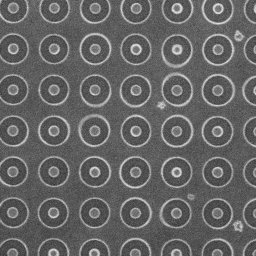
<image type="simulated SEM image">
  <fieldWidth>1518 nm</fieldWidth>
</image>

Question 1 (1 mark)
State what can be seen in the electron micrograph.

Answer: an array of small figures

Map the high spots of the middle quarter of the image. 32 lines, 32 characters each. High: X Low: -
XXXXXXXXXXXXXXXXXXXXXXXXXXXX-XXX
XXXXXXXXXXXXXXXXXXXXXXXXXXXXXXXX
XXXXXXXXXXXXXXXXXXXXXXXXXXXXXXXX
XXXXXX----XXXXXX----XXXXXX-----X
XXXXX------XXXX------XXXX------X
-XXX---X---XXX---XX--XXXX---X---
-XXX---XX---XX---XX---XXX--XX---
-XXX---XX--XXX---XX--XXXX--XX---
XXXXX------XXXX------XXXX-------
XXXXX-----XXXXX-----XXXXXX-----X
XXXXXXXXXXXXXXXXX-XXXXXXXXXXXXXX
XXXXXXXXXXXXXXXXXXXXXXXXXXXXXXXX
XXXXXXXXXXXXXXXXXXXXXXXXXXXXXXXX
XXXXXX----XXXXXX----XXXXXX----XX
XXXXX------XXXX------XXXX------X
-XXX-------XXXX------XXXX-------
-XXX---XX--XXX---XX---XX---XX---
-XXX---XX--XXXX--XX---XX---XX---
-XXX-------XXXX------XXXX-------
XXXXX-----XXXXXX-----XXXX------X
XXXXXXX-XXXXXXXXX--XXXXXXXX--XXX
XXXXXXXXXXXXXXXXXXXXXXXXXXXXXXXX
XXXXXXXXXXXXXXXXXXXXXXXXXXXXXXXX
XXXXXX--XXXXXXXXX--XXXXXXXX--XXX
XXXXX-----XXXXX------XXXX------X
-XXX-------XXX-------XXXX------X
-XXX---XX---XX---XX---XX---XX---
-XXX---XX---XX---XX---XX---XX---
-XXX-------XXX-------XXXX------X
XXXXX-----XXXXX------XXXX------X
XXXXXXX--XXXXXXX---XXXXXXXX--XXX
XXXXXXXXXXXXXXXXXXXXXXXXXXXXXXXX